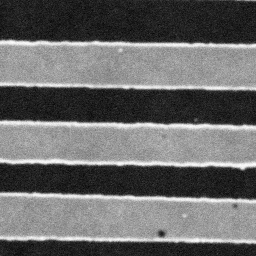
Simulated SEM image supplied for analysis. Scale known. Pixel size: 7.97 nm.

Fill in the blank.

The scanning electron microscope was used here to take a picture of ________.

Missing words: lines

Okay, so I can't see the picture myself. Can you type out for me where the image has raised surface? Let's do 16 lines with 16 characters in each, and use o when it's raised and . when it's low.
................
................
................
oooooooooooooooo
oooooooooooooooo
.......ooooooooo
................
................
oooooooooooooooo
oooooooooooooooo
................
................
ooooooooooooooo.
oooooooooooooooo
oooooooooooooooo
................